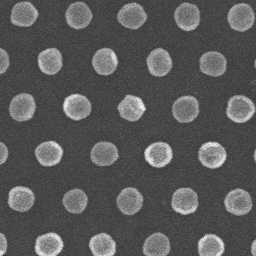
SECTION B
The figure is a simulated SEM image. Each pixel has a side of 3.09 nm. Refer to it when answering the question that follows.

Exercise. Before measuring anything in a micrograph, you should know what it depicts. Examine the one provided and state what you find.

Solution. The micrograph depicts a regular array of raised bodies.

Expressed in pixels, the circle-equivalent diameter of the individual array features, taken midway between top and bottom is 25.9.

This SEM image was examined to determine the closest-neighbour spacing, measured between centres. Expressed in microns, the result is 0.164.